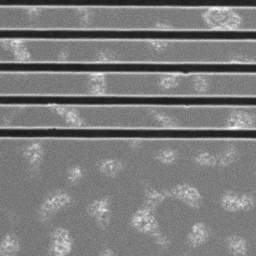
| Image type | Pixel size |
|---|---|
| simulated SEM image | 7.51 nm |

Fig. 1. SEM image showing parallel lines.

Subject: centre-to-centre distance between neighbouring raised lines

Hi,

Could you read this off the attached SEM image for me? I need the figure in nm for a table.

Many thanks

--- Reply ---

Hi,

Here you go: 247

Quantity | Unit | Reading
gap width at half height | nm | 62.9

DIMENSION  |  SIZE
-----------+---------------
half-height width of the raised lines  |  182 nanometres